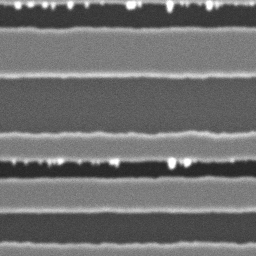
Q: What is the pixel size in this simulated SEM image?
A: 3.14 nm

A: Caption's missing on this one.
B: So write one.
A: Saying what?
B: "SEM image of lines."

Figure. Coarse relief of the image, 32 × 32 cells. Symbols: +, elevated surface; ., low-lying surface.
+++++++++......+++...+...+++..++
................................
................................
..++.....+++++.......++++..++++.
++++++++++++++++++++++++++++++++
++++++++++++++++++++++++++++++++
++++++++++++++++++++++++++++++++
++++++++++++++++++++++++++++++++
++++++++++++++++++++++++++++++++
+++....+.............+++++......
................................
................................
................................
................................
................................
................................
................................
++++++++++++++++++++++++++++++++
++++++++++++++++++++++++++++++++
++++++++++++++++++++++++++++++++
..............+......+.+........
................................
++++++++++++++++++++++++++++++++
++++++++++++++++++++++++++++++++
++++++++++++++++++++++++++++++++
++++++++++++++++++++++++++++++++
................................
................................
................................
................................
++++.........+....++..+++++++..+
++++++++++++++++++++++++++++++++